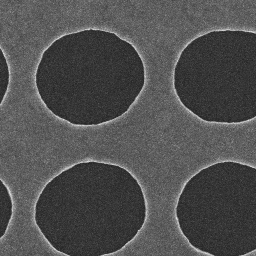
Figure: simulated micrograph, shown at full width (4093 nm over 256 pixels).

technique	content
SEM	holes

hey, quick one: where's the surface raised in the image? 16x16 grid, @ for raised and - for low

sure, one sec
@@@@@@@@@@@@@@@@
@@@@@@@@@@@@@@@@
@@@@----@@@@----
@@@------@@-----
@@-------@@-----
@@-------@@-----
@@@-----@@@-----
@@@@---@@@@@@--@
@@@@@@@@@@@@@@@@
@@@@@@@@@@@@@@@@
@@@@----@@@@@---
@@@------@@@----
-@-------@@-----
-@-------@@-----
@@@------@@-----
@@@-----@@@@----